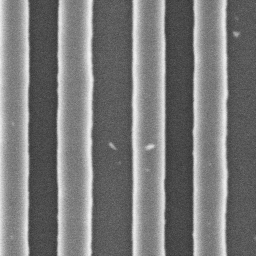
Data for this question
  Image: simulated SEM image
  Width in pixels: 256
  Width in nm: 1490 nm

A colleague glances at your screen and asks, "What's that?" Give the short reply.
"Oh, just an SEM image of lines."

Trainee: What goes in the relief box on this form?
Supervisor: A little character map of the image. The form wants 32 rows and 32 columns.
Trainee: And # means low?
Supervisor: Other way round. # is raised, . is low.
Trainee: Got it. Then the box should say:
###....####......####...####....
####...####......###....####....
####...####......###....####....
###....####......###....####....
###....####......####...####....
####...####......####...####....
####...####......####...####....
####...####......####...####....
####...####......####...####....
####...####......####...####....
####...####......###....####....
###....####......###....####....
###....####......####...####....
###....####......####...####....
###....####......####...####....
###....####......###....####....
###....####......###....####....
###....####......###....####....
###....####......####...####....
###....####......###....####....
###....####......###....####....
####...####......###....####....
###....####......###....####....
###....####......###....####....
###....####......####...####....
###....####......####...####....
###....####......###....####....
###....####......###....####....
###....####......###....####....
###....####......###....####....
###....####......###....####....
###....####......####...####....